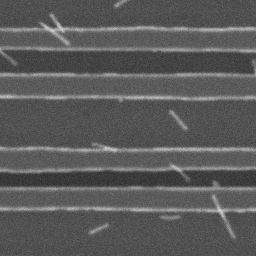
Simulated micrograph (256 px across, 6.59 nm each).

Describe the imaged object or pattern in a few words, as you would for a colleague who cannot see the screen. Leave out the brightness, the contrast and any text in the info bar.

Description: lines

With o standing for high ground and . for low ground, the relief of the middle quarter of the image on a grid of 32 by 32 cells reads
................................
................................
................................
oooooooooooooooooooooooooooooooo
oooooooooooooooooooooooooooooooo
oooooooooooooooooooooooooooooooo
oooooooooooooooooooooooooooooooo
oooooooooooooooooooooooooooooooo
o..............ooooooooooooooooo
................................
................................
................................
................................
................................
................................
................................
................................
................................
................................
................................
................................
oooooooooooooooooooooooooooooooo
oooooooooooooooooooooooooooooooo
oooooooooooooooooooooooooooooooo
oooooooooooooooooooooooooooooooo
oooooooooooooooooooooooooooooooo
oooooooooo..ooooo.oooooooo..oo..
................................
................................
................................
................................
oooooooooooooooooooooooooooooooo